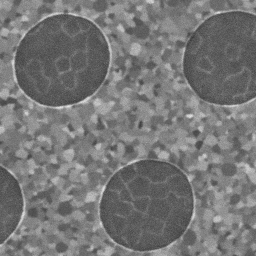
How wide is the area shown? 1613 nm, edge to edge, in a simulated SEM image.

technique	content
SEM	holes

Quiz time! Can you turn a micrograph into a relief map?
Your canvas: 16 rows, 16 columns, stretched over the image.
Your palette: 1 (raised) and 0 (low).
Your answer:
1111111111111111
1100001111111000
1000000111110000
1000000111100000
1000000111100000
1000001111110000
1110011111111001
1111111111111111
1111111111111111
1111111111111111
1111111100011111
0111111000001111
0111110000001111
0111110000001111
0111111000001111
1111111100111111